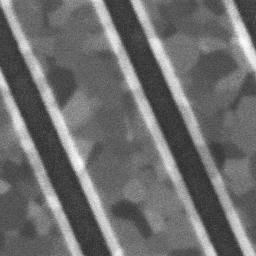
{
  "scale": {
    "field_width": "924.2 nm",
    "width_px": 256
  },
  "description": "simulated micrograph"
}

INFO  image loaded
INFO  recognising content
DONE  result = one or a few lines or trenches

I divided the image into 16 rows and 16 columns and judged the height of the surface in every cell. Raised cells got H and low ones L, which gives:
HHHHHHLLLHHHHHHL
LHHHHHHLLHHHHHHL
LHHHHHHLLLHHHHHL
LLHHHHHHLLHHHHHH
LLHHHHHHLLHHHHHH
LLLHHHHHHLLHHHHH
HLLHHHHHHLLHHHHH
HLLLHHHHHLLLHHHH
HHLLHHHHHHLLHHHH
HHLLHHHHHHLLLHHH
HHLLLHHHHHHLLHHH
HHHLLHHHHHHLLLHH
HHHLLLHHHHHHLLHH
HHHHLLHHHHHHLLHH
HHHHLLLHHHHHHLLH
HHHHHLLHHHHHHLLH